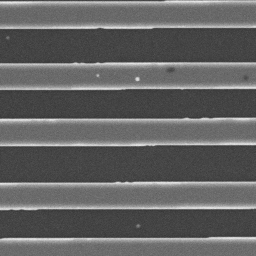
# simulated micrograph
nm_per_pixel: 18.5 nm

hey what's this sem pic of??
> lines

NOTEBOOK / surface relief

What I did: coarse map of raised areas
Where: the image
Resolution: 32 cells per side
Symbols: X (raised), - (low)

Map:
XXXXXXXXXXXXXXXXXXXXXXXXXXXXXXXX
XXXXXXXXXXXXXXXXXXXXXXXXXXXXXXXX
XXXXXXXXXXXXXXXXXXXXXXXXXXXXXXXX
XXXXXXXXXXXXXXXXXXX-------------
--------------------------------
--------------------------------
--------------------------------
--------------------------------
XXXXXXXXXXXXXXXXXXXXXXXXXXXXXXXX
XXXXXXXXXXXXXXXXXXXXXXXXXXXXXXXX
XXXXXXXXXXXXXXXXXXXXXXXXXXXXXXXX
--------------------------------
--------------------------------
--------------------------------
--------------------------------
XXXXXXXXXXXXXXXXXXXXXXXXXXXXXXXX
XXXXXXXXXXXXXXXXXXXXXXXXXXXXXXXX
XXXXXXXXXXXXXXXXXXXXXXXXXXXXXXXX
--------------------------------
--------------------------------
--------------------------------
--------------------------------
--------------------------------
XXXXXXXXXXXXXXXXXXXXXXXXXXXXXXXX
XXXXXXXXXXXXXXXXXXXXXXXXXXXXXXXX
XXXXXXXXXXXXXXXXXXXXXXXXXXXXXXXX
--------------------------------
--------------------------------
--------------------------------
--------------------------------
XXXXXXXXXXXXXXXXXXXXXXXXXXXXXXXX
XXXXXXXXXXXXXXXXXXXXXXXXXXXXXXXX